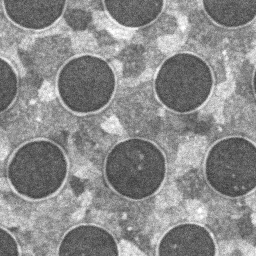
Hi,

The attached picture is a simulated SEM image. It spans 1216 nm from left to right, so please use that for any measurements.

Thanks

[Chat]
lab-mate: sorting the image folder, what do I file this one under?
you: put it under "holes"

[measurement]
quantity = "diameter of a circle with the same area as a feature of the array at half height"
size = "282 nm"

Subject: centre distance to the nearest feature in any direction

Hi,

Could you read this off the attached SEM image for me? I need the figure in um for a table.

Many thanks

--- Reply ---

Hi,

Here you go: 0.463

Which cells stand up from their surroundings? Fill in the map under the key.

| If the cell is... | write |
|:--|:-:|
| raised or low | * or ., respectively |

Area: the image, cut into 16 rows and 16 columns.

....***...***...
*..****..*****.*
****************
*****.*****.****
.***...***...***
.***...***...***
.***...***...***
****************
****************
*...***...***...
*...***...***...
*...***...***...
****************
****************
****...***...***
.***...***...***